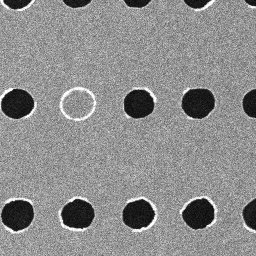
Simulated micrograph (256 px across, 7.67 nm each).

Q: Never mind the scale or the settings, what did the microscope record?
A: holes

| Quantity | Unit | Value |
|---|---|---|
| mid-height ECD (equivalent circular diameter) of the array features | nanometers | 238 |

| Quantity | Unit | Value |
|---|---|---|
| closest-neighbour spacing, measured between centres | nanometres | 462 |